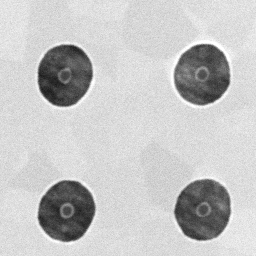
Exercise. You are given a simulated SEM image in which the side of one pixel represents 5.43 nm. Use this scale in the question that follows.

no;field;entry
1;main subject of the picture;ring-shaped grooves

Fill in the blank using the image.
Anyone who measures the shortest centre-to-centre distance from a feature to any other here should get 737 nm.